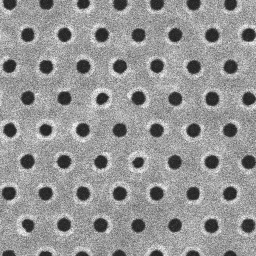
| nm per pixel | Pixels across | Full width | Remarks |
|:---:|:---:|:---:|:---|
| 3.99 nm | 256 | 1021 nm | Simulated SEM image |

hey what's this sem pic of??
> a regular array of holes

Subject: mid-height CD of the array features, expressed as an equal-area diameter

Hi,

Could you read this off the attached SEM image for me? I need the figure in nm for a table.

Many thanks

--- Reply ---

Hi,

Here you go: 56.6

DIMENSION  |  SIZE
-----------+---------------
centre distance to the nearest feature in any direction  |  36.2 px